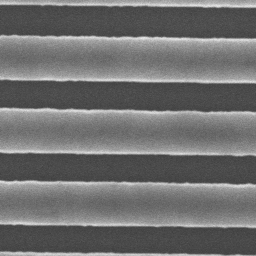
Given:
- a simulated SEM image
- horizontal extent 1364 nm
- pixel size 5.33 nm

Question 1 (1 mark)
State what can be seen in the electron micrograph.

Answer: lines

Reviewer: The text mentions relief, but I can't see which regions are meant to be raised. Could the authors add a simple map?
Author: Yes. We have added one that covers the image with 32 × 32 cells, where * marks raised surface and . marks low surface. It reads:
********************************
................................
................................
................................
***.............................
********************************
********************************
********************************
********************************
********************************
................................
................................
................................
................................
********************************
********************************
********************************
********************************
********************************
................................
................................
................................
................................
********************************
********************************
********************************
********************************
********************************
................................
................................
................................
................................